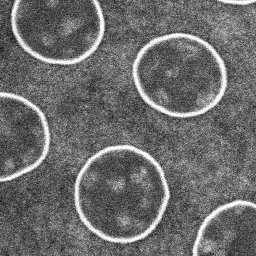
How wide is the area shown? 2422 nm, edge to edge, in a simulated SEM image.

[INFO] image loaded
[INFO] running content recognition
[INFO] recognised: raised bodies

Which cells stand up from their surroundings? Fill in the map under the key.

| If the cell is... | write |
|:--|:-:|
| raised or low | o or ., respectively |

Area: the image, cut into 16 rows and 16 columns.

.ooooo..........
.ooooo..........
.ooooo....oo....
..ooo....ooooo..
........oooooo..
.........ooooo..
oo.......oooo...
ooo.............
ooo.............
ooo...ooo.......
oo...ooooo......
.....ooooo......
.....ooooo......
.....ooooo...ooo
......ooo....ooo
............oooo